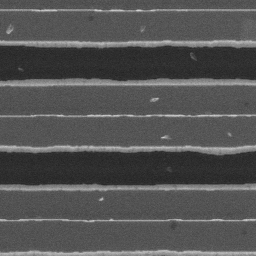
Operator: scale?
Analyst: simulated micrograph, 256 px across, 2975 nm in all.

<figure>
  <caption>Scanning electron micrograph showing lines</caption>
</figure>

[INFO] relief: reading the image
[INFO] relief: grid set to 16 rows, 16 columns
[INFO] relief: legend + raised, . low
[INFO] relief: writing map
++++++++++++++++
++++++++++++++++
++++++++++++++++
................
................
++++++++++++++++
++++++++++++++++
++++++++++++++++
++++++++++++++++
................
................
................
++++++++++++++++
++++++++++++++++
++++++++++++++++
++++++++++++++++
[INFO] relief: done